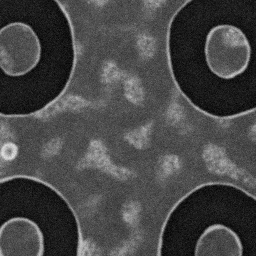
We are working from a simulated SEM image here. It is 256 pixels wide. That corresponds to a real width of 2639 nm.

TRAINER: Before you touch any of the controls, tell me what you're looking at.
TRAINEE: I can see ring-shaped grooves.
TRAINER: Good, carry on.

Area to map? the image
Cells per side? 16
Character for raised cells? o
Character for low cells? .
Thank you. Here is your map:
....ooooooo.....
....ooooooo.....
oo...oooooo..oo.
oo...oooooo..ooo
oo..ooooooo..oo.
....ooooooo.....
...ooooooooo....
oooooooooooooooo
oooooooooooooooo
oooooooooooooooo
oooooooooooooooo
...ooooooooooooo
....ooooooo.....
.....oooooo.....
oo...ooooo...o..
ooo..ooooo..ooo.